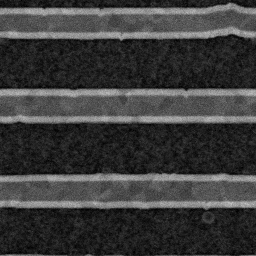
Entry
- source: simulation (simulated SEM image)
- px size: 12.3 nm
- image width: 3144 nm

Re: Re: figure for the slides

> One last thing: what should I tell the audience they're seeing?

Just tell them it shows one or a few lines or trenches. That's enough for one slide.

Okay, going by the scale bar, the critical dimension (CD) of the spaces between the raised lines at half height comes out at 725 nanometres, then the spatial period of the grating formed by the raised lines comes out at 1.04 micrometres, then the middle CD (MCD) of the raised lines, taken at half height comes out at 316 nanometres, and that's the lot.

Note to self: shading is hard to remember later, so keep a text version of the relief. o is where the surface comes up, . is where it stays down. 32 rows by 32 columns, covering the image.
................................
oooooooooooooooooooooooooooooooo
oooooooooooooooooooooooooooooooo
oooooooooooooooooooooooooooooooo
................................
................................
................................
................................
................................
................................
................................
................................
oooooooooooooooooooooooooooooooo
oooooooooooooooooooooooooooooooo
oooooooooooooooooooooooooooooooo
................................
................................
................................
................................
................................
................................
................................
oooooooooooooooooooooooooooooooo
oooooooooooooooooooooooooooooooo
oooooooooooooooooooooooooooooooo
..ooooooo.oooooooooooooo.ooooo..
................................
................................
................................
................................
................................
................................